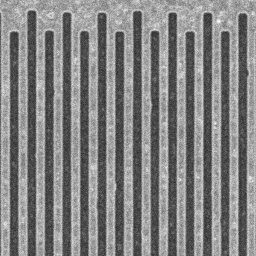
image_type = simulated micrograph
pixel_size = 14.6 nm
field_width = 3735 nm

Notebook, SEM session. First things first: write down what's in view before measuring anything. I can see parallel lines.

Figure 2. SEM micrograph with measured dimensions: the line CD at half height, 113 nanometres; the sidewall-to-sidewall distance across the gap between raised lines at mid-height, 137 nm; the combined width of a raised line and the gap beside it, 256 nanometers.